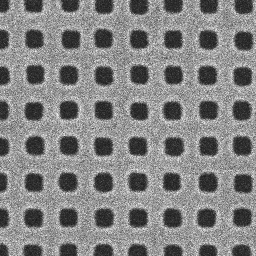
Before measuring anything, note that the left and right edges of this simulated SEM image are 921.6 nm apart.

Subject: a regular array of holes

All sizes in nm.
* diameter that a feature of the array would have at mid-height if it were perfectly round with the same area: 72.9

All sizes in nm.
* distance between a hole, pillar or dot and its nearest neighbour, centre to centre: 122